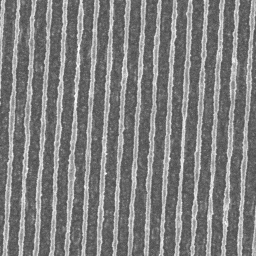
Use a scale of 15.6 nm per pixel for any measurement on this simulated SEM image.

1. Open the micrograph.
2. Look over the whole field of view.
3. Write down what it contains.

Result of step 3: parallel lines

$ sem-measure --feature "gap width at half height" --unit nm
183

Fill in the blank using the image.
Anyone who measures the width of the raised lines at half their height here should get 0.0641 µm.